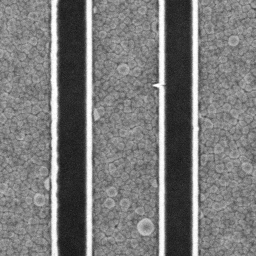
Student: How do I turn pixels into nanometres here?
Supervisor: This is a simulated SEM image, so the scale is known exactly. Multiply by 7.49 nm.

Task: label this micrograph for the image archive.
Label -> one or a few lines or trenches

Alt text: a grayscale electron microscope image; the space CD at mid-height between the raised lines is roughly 543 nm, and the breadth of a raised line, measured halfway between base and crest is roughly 256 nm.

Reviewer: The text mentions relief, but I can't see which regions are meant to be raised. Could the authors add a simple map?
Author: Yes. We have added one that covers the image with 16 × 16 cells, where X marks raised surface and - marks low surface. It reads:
---XXX----XX----
---XXX----XX----
---XXX----XX----
---XXX----XX----
---XXX----XX----
---XXX----XX----
---XXX----XX----
---XXX----XX----
---XXX----XX----
---XXX----XX----
---XXX----XX----
---XXX----XX----
---XXX----XX----
---XXX----XX----
---XXX----XX----
---XXX----XX----